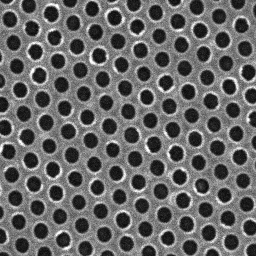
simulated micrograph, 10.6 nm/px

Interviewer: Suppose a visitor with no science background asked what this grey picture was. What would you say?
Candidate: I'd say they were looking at a regular array of holes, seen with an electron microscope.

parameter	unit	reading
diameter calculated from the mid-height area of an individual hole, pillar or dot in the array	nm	166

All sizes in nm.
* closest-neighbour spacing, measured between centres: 248